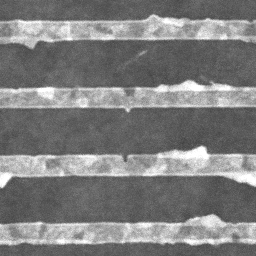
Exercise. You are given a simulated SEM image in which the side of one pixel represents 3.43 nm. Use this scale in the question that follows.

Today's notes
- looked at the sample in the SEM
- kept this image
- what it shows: one or a few lines or trenches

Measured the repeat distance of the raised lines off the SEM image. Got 232 nm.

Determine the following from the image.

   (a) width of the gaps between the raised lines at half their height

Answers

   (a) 165 nm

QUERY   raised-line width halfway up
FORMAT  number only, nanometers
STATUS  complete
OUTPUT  67.4